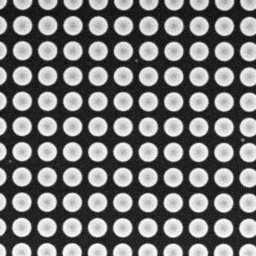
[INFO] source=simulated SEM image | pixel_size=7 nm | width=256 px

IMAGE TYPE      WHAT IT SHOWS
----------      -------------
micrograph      an array of small figures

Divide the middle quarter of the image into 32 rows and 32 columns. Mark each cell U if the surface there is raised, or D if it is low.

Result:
DDDDDDDDDDDDDDDDDDDDDDDDDDDDDDDD
UUUUDDDUUUDDDUUUUDDDUUUDDDUUUDDD
UUUUDDUUUUUDDUUUUDDUUUUDDUUUUUDD
UUUUDDUUUUUDDUUUUDDUUUUDDUUUUUDD
UUUUDDDUUUDDDUUUUDDUUUUDDDUUUDDD
DDDDDDDDDDDDDDDDDDDDDDDDDDDDDDDD
DDDDDDDDDDDDDDDDDDDDDDDDDDDDDDDD
DUUDDDDUUUDDDDUUDDDDUUDDDDUUUDDD
UUUUDDUUUUUDDUUUUDDUUUUDDUUUUDDD
UUUUDDUUUUUDDUUUUDDUUUUDDUUUUUDD
UUUUDDUUUUDDDUUUUDDUUUUDDUUUUDDD
DUUDDDDDUDDDDDUUDDDDUUDDDDUUUDDD
DDDDDDDDDDDDDDDDDDDDDDDDDDDDDDDD
DDDDDDDDDDDDDDDDDDDDDDDDDDDDDDDD
UUUUDDUUUUDDDUUUUDDUUUUDDUUUUDDD
UUUUDDUUUUUDDUUUUDDUUUUDDUUUUUDD
UUUUDDUUUUUDDUUUUDDUUUUDDUUUUUDD
DUUUDDDUUUDDDUUUDDDDUUDDDDUUUDDD
DDDDDDDDDDDDDDDDDDDDDDDDDDDDDDDD
DDDDDDDDDDDDDDDDDDDDDDDDDDDDDDDD
UUUUDDDUUUDDDUUUDDDUUUUDDDUUUDDD
UUUUDDUUUUUDDUUUUDDUUUUDDUUUUUDU
UUUUDDUUUUUDDUUUUDDUUUUDDUUUUUDU
DUUUDDDUUUDDDUUUDDDUUUUDDDUUUDDD
DDDDDDDDDDDDDDDDDDDDDDDDDDDDDDDD
DDDDDDDDDDDDDDDDDDDDDDDDDDDDDDDD
DUUUDDDUUUDDDUUUDDDDUUDDDDUUUDDD
UUUUDDUUUUUDDUUUUDDUUUUDDUUUUDDD
UUUUDDUUUUUDDUUUUDDUUUUDDUUUUUDU
UUUUDDUUUUDDDUUUUDDUUUUDDUUUUDDD
DUUDDDDDUDDDDDUUDDDDUUDDDDUUDDDD
DDDDDDDDDDDDDDDDDDDDDDDDDDDDDDDD